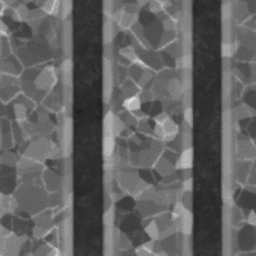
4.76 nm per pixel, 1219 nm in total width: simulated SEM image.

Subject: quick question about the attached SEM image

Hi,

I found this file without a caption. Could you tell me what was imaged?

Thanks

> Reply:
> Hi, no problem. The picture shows one or a few lines or trenches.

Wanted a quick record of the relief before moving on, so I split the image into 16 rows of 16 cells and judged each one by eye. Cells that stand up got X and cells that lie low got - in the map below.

XXXX---XXXXX--XX
XXXX---XXXXX--XX
XXXX---XXXXX--XX
XXXX---XXXXX--XX
XXXX---XXXXX--XX
XXXX---XXXXX--XX
XXXX---XXXXX--XX
XXXX---XXXXX--XX
XXXX---XXXXX--XX
XXXX---XXXXX--XX
XXXX---XXXXX--XX
XXXX---XXXXX--XX
XXXX---XXXXX--XX
XXXX---XXXXX--XX
XXXX---XXXXX--XX
XXXX---XXXXX--XX